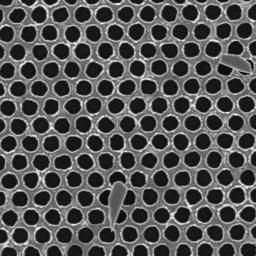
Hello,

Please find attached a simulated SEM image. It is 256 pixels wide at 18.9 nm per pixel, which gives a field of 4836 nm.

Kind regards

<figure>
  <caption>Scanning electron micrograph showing a regular array of holes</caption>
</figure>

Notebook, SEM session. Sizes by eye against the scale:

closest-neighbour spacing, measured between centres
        392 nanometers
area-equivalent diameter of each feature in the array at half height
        298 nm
